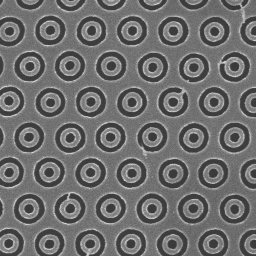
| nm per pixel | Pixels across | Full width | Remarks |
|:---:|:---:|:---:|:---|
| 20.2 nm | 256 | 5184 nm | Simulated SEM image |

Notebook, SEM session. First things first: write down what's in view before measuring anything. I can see a regular array of ring-shaped grooves with a dot in the middle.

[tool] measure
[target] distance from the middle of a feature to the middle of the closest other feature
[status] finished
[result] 816 nm